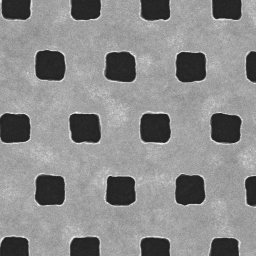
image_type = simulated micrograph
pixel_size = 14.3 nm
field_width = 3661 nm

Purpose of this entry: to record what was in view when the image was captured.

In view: a regular array of holes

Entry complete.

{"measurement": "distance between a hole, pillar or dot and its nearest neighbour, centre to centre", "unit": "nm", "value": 1010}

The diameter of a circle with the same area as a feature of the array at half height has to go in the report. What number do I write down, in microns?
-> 0.461